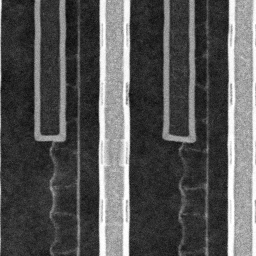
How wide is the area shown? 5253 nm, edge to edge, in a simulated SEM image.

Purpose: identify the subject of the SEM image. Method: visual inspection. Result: wiring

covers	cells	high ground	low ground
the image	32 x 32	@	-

-----@@@-----@@@-----@@@-----@@@
-----@@@-----@@@-----@@@-----@@@
-----@@@-----@@@-----@@@-----@@@
-----@@@-----@@@-----@@@-----@@@
-----@@@-----@@@-----@@@-----@@@
-----@@@-----@@@-----@@@-----@@@
-----@@@-----@@@-----@@@-----@@@
-----@@@-----@@@-----@@@-----@@@
-----@@@-----@@@-----@@@-----@@@
-----@@@-----@@@-----@@@-----@@@
-----@@@-----@@@-----@@@-----@@@
-----@@@-----@@@-----@@@-----@@@
-----@@@-----@@@-----@@@-----@@@
-----@@@-----@@@-----@@@-----@@@
-----@@@-----@@@-----@@@-----@@@
-----@@@-----@@@-----@@@-----@@@
-----@@@-----@@@-----@@@-----@@@
-------------@@@-------------@@@
-------------@@@-------------@@@
-------------@@@-------------@@@
-------------@@@-------------@@@
-------------@@@-------------@@@
-------------@@@-------------@@@
-------------@@@-------------@@@
-------------@@@-------------@@@
-------------@@@-------------@@@
-------------@@@-------------@@@
-------------@@@-------------@@@
-------------@@@-------------@@@
-------------@@@-------------@@@
-------------@@@-------------@@@
-------------@@@-------------@@@